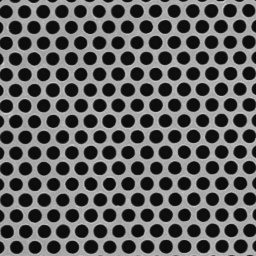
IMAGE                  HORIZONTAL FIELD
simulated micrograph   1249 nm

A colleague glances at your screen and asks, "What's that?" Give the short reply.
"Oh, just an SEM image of a regular array of holes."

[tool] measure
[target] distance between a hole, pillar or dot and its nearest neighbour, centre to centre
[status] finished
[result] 87.4 nanometers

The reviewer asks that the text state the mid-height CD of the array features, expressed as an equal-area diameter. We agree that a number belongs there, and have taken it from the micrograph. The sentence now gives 63.4 nanometres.